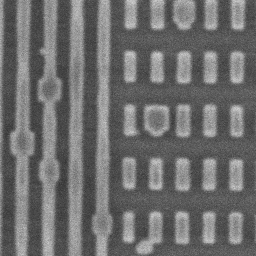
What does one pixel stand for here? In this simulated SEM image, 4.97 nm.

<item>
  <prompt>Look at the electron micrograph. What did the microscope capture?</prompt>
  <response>wiring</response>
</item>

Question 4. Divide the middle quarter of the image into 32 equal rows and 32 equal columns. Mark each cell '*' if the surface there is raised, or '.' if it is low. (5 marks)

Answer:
..***....**....***....**.....**.
..***....**....***....**.....**.
..***....**....***....**.....**.
..**.....**....***....**....***.
..**.....**..................**.
..**.....**.....................
..**.....**.....................
..**.....**.....................
..**.....**.....................
..**.....**.....................
..**.....**..................**.
..**.....**....***..******..***.
..**.....**.....**..******..***.
..**.....**.....**..******..***.
..**.....**....***..******..***.
..**.....**....***..******..***.
..**.....**....***...****...***.
..**.....**....**.....**....***.
..**.....**.....................
..**.....**.....................
..**.....**.....................
..**.....**.....................
..**.....**.....................
..**.....**.....................
..**....***....***....**....***.
.***....***....***....**....***.
.***....***....***...***....***.
.***....***....***...***....***.
.***....***....***...***....***.
.***....***....***...***....***.
.***....***....**....***....***.
.***....***.....................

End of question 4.